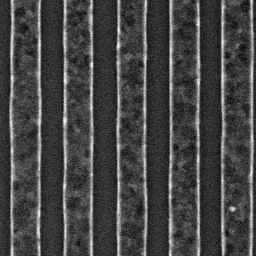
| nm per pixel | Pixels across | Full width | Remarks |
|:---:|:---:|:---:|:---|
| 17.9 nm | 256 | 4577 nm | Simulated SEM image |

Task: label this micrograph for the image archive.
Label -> wiring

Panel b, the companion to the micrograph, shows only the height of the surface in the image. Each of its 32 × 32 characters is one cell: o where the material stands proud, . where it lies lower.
.oooo...ooo....ooo...oooo...ooo.
.oooo...ooo....ooo...oooo...ooo.
..ooo...ooo....ooo...oooo...ooo.
.oooo...ooo....ooo...oooo...ooo.
.oooo...ooo....ooo...oooo...oooo
.oooo...ooo....ooo...oooo...oooo
.oooo...ooo....ooo...oooo...oooo
.oooo...ooo....ooo...oooo...oooo
.oooo...ooo....ooo...oooo...ooo.
.oooo...ooo....ooo...oooo...ooo.
.oooo...ooo....ooo...oooo...ooo.
.oooo...ooo....ooo...oooo...ooo.
.oooo...ooo....ooo...oooo...ooo.
.oooo...ooo....ooo...oooo...ooo.
.oooo...ooo....ooo...oooo...ooo.
.oooo...oooo...ooo...oooo...ooo.
.oooo...oooo...ooo...oooo...ooo.
.oooo...oooo...ooo...oooo...oooo
.oooo...ooo....ooo...oooo...oooo
.oooo...ooo....ooo...oooo...oooo
.oooo...ooo....ooo...oooo...ooo.
.oooo...ooo....ooo...oooo...ooo.
.oooo...ooo....ooo...oooo...ooo.
.oooo...ooo....ooo...oooo...ooo.
.oooo...ooo....ooo...oooo...ooo.
.oooo...ooo....ooo...oooo...ooo.
.oooo...ooo....ooo...oooo...ooo.
.oooo...ooo....ooo...oooo...ooo.
.oooo...ooo....ooo...oooo...ooo.
.oooo...ooo....ooo...oooo...ooo.
.oooo...ooo....ooo...oooo...ooo.
.oooo...ooo....ooo...oooo...ooo.